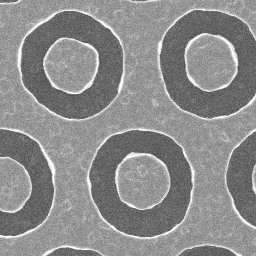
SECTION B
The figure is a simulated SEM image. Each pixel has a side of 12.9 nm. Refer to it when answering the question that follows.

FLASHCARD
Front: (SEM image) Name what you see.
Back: ring-shaped grooves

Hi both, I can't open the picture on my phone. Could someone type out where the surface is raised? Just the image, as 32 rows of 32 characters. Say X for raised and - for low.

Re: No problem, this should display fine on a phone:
XXXXXXXXXXXXXXXXXXXXXXXXXXXXXXXX
XXXXXXXX--XXXXXXXXXXXXXX----XXXX
XXXXXX------XXXXXXXXXX--------XX
XXXX----------XXXXXXX----------X
XXX-----------XXXXXXX----XX-----
XXX----XXXX----XXXXX----XXXXX---
XXX---XXXXXX---XXXXX---XXXXXX---
XX----XXXXXX---XXXXX---XXXXXXX--
XX----XXXXXX---XXXXX---XXXXXXX--
XXX---XXXXXX---XXXXX---XXXXXX---
XXX---XXXXX----XXXXXX---XXXXX---
XXXX----XX-----XXXXXX-----------
XXXXX---------XXXXXXXX---------X
XXXXXX-------XXXXXXXXXX-------XX
XXXXXXXX----XXXXXXXXXXXXX---XXXX
XXXXXXXXXXXXXXXXXXXXXXXXXXXXXXXX
--XXXXXXXXXXXXXX----XXXXXXXXXXXX
----XXXXXXXXX---------XXXXXXXX--
-----XXXXXXX-----------XXXXXXX--
------XXXXXX----XXX----XXXXXX---
XXX---XXXXX----XXXXXX---XXXXX---
XXX----XXXX----XXXXXX---XXXX----
XXXX---XXXX----XXXXXX---XXXX----
XXXX---XXXX----XXXXXX---XXXX----
XXXX---XXXX----XXXXXX---XXXXX---
XXX----XXXXX----XXXX----XXXXX---
-X----XXXXXXX----------XXXXXXX--
------XXXXXXX----------XXXXXXX--
----XXXXXXXXXX--------XXXXXXXXXX
--XXXXXXXXXXXXXXX---XXXXXXXXXXXX
XXXXXXXXXXXXXXXXXXXXXXXXXXXXXXXX
XXXXXX------XXXXXXXXXXX------XXX